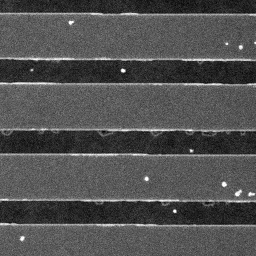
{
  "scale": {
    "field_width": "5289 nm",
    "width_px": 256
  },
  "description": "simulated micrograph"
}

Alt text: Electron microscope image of lines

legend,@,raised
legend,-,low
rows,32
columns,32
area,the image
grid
--------------------------------
--------------------------------
@@@@@@@@@@@@@@@@@@@@@@@@@@@@@@@@
@@@@@@@@@@@@@@@@@@@@@@@@@@@@@@@@
@@@@@@@@@@@@@@@@@@@@@@@@@@@@@@@@
@@@@@@@@@@@@@@@@@@@@@@@@@@@@@@@@
@@@@@@@@@@@@@@@@@@@@@@@@@@@@@@@@
---------------@-@@---@@@@@@@@@@
--------------------------------
--------------------------------
@@@@@@@-------------------------
@@@@@@@@@@@@@@@@@@@@@@@@@@@@@@@@
@@@@@@@@@@@@@@@@@@@@@@@@@@@@@@@@
@@@@@@@@@@@@@@@@@@@@@@@@@@@@@@@@
@@@@@@@@@@@@@@@@@@@@@@@@@@@@@@@@
@@@@@@@@@@@@@@@@@@@@@@@@@@@@@@@@
--------------------------------
--------------------------------
--------------------------------
@@@@@@@@@@@@@@@@@@@@@@@@@@@@@@@@
@@@@@@@@@@@@@@@@@@@@@@@@@@@@@@@@
@@@@@@@@@@@@@@@@@@@@@@@@@@@@@@@@
@@@@@@@@@@@@@@@@@@@@@@@@@@@@@@@@
@@@@@@@@@@@@@@@@@@@@@@@@@@@@@@@@
@@@@@@@@@@@@@@@@@@@@@@@@@@@@@@@@
--------------------------------
--------------------------------
--------------------------------
@@@@@@@@@@@@@@@@@@@@@@@@@@@@@@@@
@@@@@@@@@@@@@@@@@@@@@@@@@@@@@@@@
@@@@@@@@@@@@@@@@@@@@@@@@@@@@@@@@
@@@@@@@@@@@@@@@@@@@@@@@@@@@@@@@@